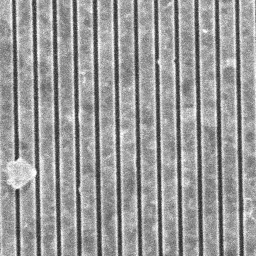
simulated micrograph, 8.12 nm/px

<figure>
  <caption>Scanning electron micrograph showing parallel lines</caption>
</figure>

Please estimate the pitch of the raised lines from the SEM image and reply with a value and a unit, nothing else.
164 nanometers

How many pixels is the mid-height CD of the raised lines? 14.2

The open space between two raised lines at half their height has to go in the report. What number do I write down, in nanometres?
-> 47.7